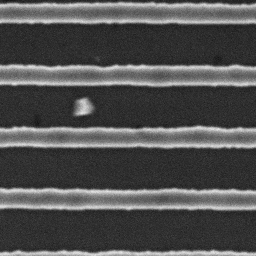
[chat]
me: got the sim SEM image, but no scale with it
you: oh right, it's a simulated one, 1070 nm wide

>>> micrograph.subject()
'lines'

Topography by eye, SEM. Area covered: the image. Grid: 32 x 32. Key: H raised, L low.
LLLLLLLLLLLLHHHHHLHHLLLLLLLLLLLL
HHHHHHHHHHHHHHHHHHHHHHHHHHHHHHHH
HHHHHHHHHHHHHHHHHHHHHHHHHHHHHHHH
LLLLLLLLLLLLLLLLLLLLLLLLLLLLLLLL
LLLLLLLLLLLLLLLLLLLLLLLLLLLLLLLL
LLLLLLLLLLLLLLLLLLLLLLLLLLLLLLLL
LLLLLLLLLLLLLLLLLLLLLLLLLLLLLLLL
LLLLLLLLLLLLLLLLLLLLLLLLLLLLLLLL
HHHHHHHHHHHHHHHHHHHHHHHHHHHHHHHH
HHHHHHHHHHHHHHHHHHHHHHHHHHHHHHHH
LHHLHHHHHHHHHHLLHHHHHHHHHHHHHHHH
LLLLLLLLLLLLLLLLLLLLLLLLLLLLLLLL
LLLLLLLLLLHLLLLLLLLLLLLLLLLLLLLL
LLLLLLLLLLHLLLLLLLLLLLLLLLLLLLLL
LLLLLLLLLLLLLLLLLLLLLLLLLLLLLLLL
LLLLLLLLLLLLLLLLLLLLLLLLLLLLLLLL
HHHHHHHHHHHHHHHHHHHHHHHHHHHHHHHH
HHHHHHHHHHHHHHHHHHHHHHHHHHHHHHHH
LLLLLLLLLLLLLLLLLLLLLLLLLLLLLLLL
LLLLLLLLLLLLLLLLLLLLLLLLLLLLLLLL
LLLLLLLLLLLLLLLLLLLLLLLLLLLLLLLL
LLLLLLLLLLLLLLLLLLLLLLLLLLLLLLLL
LLLLLLLLLLLLLLLLLLLLLLLLLLLLLLLL
LLLLLLLLLLLLLLLLLLLLLLLLLLLLLLLL
HHHHHHHHHHHHHHHHHHHHHHHHHHHHHHHH
HHHHHHHHHHHHHHHHHHHHHHHHHHHHHHHH
LLLLLLLLLLLLLLLLLLLLLLLLLLLLLLLL
LLLLLLLLLLLLLLLLLLLLLLLLLLLLLLLL
LLLLLLLLLLLLLLLLLLLLLLLLLLLLLLLL
LLLLLLLLLLLLLLLLLLLLLLLLLLLLLLLL
LLLLLLLLLLLLLLLLLLLLLLLLLLLLLLLL
LLHLHHLHHHLLLHHHHLHLLHHHHHHHHLLL